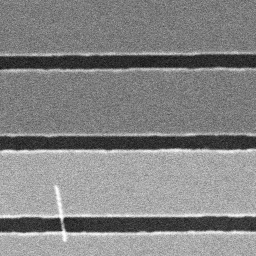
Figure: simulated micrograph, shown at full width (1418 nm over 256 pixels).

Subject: lines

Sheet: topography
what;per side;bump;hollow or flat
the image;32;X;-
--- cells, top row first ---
XXXXXXXXXXXXXXXXXXXXXXXXXXXXXXXX
XXXXXXXXXXXXXXXXXXXXXXXXXXXXXXXX
XXXXXXXXXXXXXXXXXXXXXXXXXXXXXXXX
XXXXXXXXXXXXXXXXXXXXXXXXXXXXXXXX
XXXXXXXXXXXXXXXXXXXXXXXXXXXXXXXX
XXXXXXXXXXXXXXXXXXXXXXXXXXXXXXXX
XXXXXXXXXXXXXXXXXXXXXXXXXXXXXXXX
--------------------------------
--------------------------XX----
XXXXXXXXXXXXXXXXXXXXXXXXXXXXXXXX
XXXXXXXXXXXXXXXXXXXXXXXXXXXXXXXX
XXXXXXXXXXXXXXXXXXXXXXXXXXXXXXXX
XXXXXXXXXXXXXXXXXXXXXXXXXXXXXXXX
XXXXXXXXXXXXXXXXXXXXXXXXXXXXXXXX
XXXXXXXXXXXXXXXXXXXXXXXXXXXXXXXX
XXXXXXXXXXXXXXXXXXXXXXXXXXXXXXXX
XXXXXXXXXXXXXXXXXXXXXXXXXXXXXXXX
--------------------------------
--------------------------------
XXXXXXXXXXXXXXXXXXXXXXXXXXXXXXXX
XXXXXXXXXXXXXXXXXXXXXXXXXXXXXXXX
XXXXXXXXXXXXXXXXXXXXXXXXXXXXXXXX
XXXXXXXXXXXXXXXXXXXXXXXXXXXXXXXX
XXXXXXXXXXXXXXXXXXXXXXXXXXXXXXXX
XXXXXXXXXXXXXXXXXXXXXXXXXXXXXXXX
XXXXXXXXXXXXXXXXXXXXXXXXXXXXXXXX
XXXXXXXXXXXXXXXXXXXXXXXXXXXXXXXX
--------------------------------
--------------------------------
XXXXXXXXXXXXXXXXXXXXXXXXXXXXXXXX
XXXXXXXXXXXXXXXXXXXXXXXXXXXXXXXX
XXXXXXXXXXXXXXXXXXXXXXXXXXXXXXXX